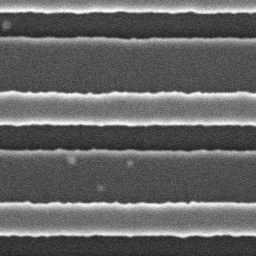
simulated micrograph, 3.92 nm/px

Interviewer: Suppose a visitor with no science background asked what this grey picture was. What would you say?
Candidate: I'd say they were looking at lines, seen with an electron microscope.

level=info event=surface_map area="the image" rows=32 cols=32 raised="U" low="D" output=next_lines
UUUUUUUUUUUUUUUUUUUUUUUUUUUUUUUU
DDDDDUUDDUUDDDDDDDDDDUDDUUUUDUDD
DDDDDDDDDDDDDDDDDDDDDDDDDDDDDDDD
DDDDDDDDDDDDDDDDDDDDDDDDDDDDDDDD
DDDDDDDDDDDDDDDDDDDDDDDDDDDDDDDD
DDDDDDDDDDDDDDDDDDDDDDDDDDDDDDDD
DDDDDDDDDDDDDDDDDDDDDDDDDDDDDDDD
DDDDDDDDDDDDDDDDDDDDDDDDDDDDDDDD
DDDDDDDDDDDDDDDDDDDDDDDDDDDDDDDD
DDDDDDDDDDDDDDDDDDDDDDDDDDDDDDDD
DDDDDDDDDDDDDDDDDDDDDDDDDDDDDDDD
DUDDDDDDDDDDDDDDDDDDDDDDDDDDDDDD
UUUUUUUUUUUUUUUUUUUUUUUUUUUUUUUU
UUUUUUUUUUUUUUUUUUUUUUUUUUUUUUUU
UUUUUUUUUUUUUUUUUUUUUUUUUUUUUUUU
UUUUDDUUUUUUUUUUUUUUUUUUUUUUUUUU
DDDDDDDDDDDDDDDDDDDDDDDDDDDDDDDD
DDDDDDDDDDDDDDDDDDDDDDDDDDDDDDDD
DDDDDDDDDDDDDDDDDDDDDDDDDDDDDDDD
DDDDDDDDDDDDDDDDDDDDDDDDDDDDDDDD
DDDDDDDDDDDDDDDDDDDDDDDDDDDDDDDD
DDDDDDDDDDDDDDDDDDDDDDDDDDDDDDDD
DDDDDDDDDDDDDDDDDDDDDDDDDDDDDDDD
DDDDDDDDDDDDDDDDDDDDDDDDDDDDDDDD
DDDDDDDDDDDDDDDDDDDDDDDDDDDDDDDD
UUUUDDUUUUUUUUUDDUDDDUUUUUUUUUUU
UUUUUUUUUUUUUUUUUUUUUUUUUUUUUUUU
UUUUUUUUUUUUUUUUUUUUUUUUUUUUUUUU
UUUUUUUUUUUUUUUUUUUUUUUUUUUUUUUU
DDDDDDDDDDDDDDDDDDDDDDUUDDDDDDDD
DDDDDDDDDDDDDDDDDDDDDDDDDDDDDDDD
DDDDDDDDDDDDDDDDDDDDDDDDDDDDDDDD